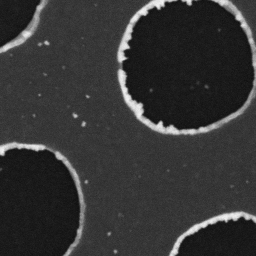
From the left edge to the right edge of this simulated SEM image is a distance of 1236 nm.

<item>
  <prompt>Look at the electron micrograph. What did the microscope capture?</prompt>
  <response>holes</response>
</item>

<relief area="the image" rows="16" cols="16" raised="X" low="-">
--XXXXXXXX----XX
--XXXXXX-------X
-XXXXXXX--------
XXXXXXXX--------
XXXXXXXX--------
XXXXXXXX--------
XXXXXXXXX------X
XXXXXXXXX-----XX
XXXXXXXXXXXXXXXX
---XXXXXXXXXXXXX
----XXXXXXXXXXXX
-----XXXXXXXXXXX
-----XXXXXXXXXXX
-----XXXXXXXXXXX
-----XXXXXXX----
----XXXXXXX-----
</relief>